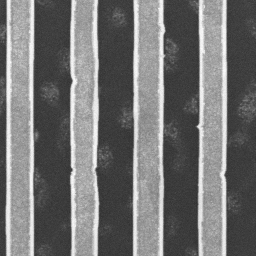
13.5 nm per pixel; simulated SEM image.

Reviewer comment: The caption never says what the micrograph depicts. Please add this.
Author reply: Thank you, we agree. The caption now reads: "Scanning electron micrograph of one or a few lines or trenches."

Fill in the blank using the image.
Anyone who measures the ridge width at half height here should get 328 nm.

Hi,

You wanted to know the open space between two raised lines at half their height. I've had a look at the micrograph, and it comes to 535 nm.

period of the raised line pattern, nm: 869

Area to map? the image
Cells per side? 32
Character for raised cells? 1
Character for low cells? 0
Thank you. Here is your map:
01110000011100000111000001110000
01110000011100000111000001110000
01110000011100000111000001110000
01110000011100000111000001110000
01110000011100000111000001110000
01110000011100000111000001110000
01110000011100000111000001110000
01110000011100000111000001110000
01110000011100000111000001110000
01110000011100000111000001110000
01110000011100000111000001110000
01110000011100000111000001110000
01110000011100000111000001110000
01110000011100000111000001110000
01110000011100000111000001110000
01110000011100000111000001110000
01110000011100000111000001110000
01110000011100000111000001110000
01110000011100000111000001110000
01110000011100000111000001110000
01110000011100000111000001110000
01110000011100000111000001110000
01110000011100000111000001110000
01110000011100000111000001110000
01110000011100000111000001110000
01110000011100000111000001110000
01110000011100000111000001110000
01110000011100000111000001110000
01110000011100000111000001110000
01110000011100000111000001110000
01110000011100000111000001110000
01110000011100000111000001110000